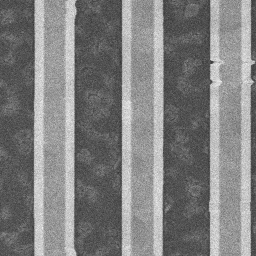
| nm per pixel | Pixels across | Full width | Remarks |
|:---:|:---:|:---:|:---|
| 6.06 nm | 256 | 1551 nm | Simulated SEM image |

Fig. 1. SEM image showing one or a few lines or trenches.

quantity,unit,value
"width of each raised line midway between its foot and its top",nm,194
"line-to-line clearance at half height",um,0.335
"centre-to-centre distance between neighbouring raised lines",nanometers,533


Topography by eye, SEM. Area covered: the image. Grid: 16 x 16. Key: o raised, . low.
..ooo...oo...oo.
..oo....oo...oo.
..oo....oo...oo.
..oo....oo...oo.
..oo....oo...oo.
..oo....oo...oo.
..oo....oo...oo.
..oo....oo...oo.
..oo....oo...oo.
..oo....oo...oo.
..oo....oo...oo.
..oo....oo...oo.
..oo....oo...oo.
..oo....oo...oo.
..oo....oo...oo.
..oo....oo...oo.